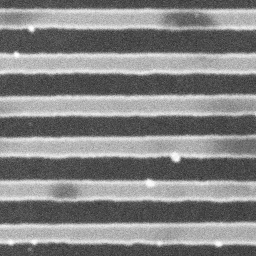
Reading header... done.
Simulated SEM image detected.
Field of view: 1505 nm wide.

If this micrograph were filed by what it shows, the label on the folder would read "lines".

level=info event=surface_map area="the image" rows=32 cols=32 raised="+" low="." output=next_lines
................................
++++++++++++++++++++++++++++++++
++++++++++++++++++++++++++++++++
...+..........+....+++++++++++++
................................
................................
................................
++++++++++++++++++++++++++++++++
++++++++++++++++++++++++++++++++
................................
................................
................................
++++++++++++++++++++++++++++++++
++++++++++++++++++++++++++++++++
................................
................................
................................
++++++++++++++++++++++++++++++++
++++++++++++++++++++++++++++++++
+++++++++++++..+++++.+++++++++++
................................
................................
..................+.............
++++++++++++++++++++++++++++++++
++++++++++++++++++++++++++++++++
................................
................................
................................
++++++++++++++++++++++++++++++++
++++++++++++++++++++++++++++++++
...................++......+....
................................